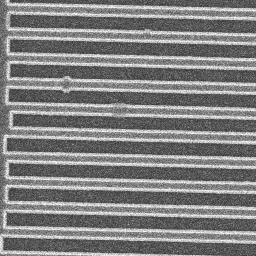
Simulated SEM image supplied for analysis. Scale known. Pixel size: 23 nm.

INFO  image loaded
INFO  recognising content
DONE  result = parallel lines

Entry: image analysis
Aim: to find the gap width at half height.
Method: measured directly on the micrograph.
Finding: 15.5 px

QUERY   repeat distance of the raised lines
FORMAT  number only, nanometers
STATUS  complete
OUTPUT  570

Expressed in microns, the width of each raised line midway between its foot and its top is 0.209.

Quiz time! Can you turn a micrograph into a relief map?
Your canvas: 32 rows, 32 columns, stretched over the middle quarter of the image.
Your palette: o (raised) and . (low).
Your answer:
...................ooooooooooooo
................................
................................
o...............................
ooooooooooooooo....ooooo........
oooooooooooooooooooooooooooooooo
o...........oooooooooooooooooooo
................................
................................
................................
oooooooo...ooooo................
oooooooooooooooooooooooooooooooo
.....ooooooooooooooooooooooooooo
................................
................................
................................
o...............................
oooooooooooooooooooooooooooooooo
oooooooooooooooooooooooooooooooo
................................
................................
................................
................................
oooooooooooooooooooooooooooooooo
oooooooooooooooooooooooooooooooo
................................
................................
................................
................................
ooooooooooooooooooooooooooo.....
oooooooooooooooooooooooooooooooo
.........................ooooooo